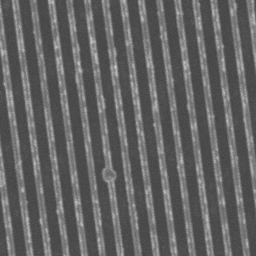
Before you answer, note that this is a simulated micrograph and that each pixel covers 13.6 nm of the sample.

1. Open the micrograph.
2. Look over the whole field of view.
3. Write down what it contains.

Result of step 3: parallel lines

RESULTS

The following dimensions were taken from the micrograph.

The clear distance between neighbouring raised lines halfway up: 0.167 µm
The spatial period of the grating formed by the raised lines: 244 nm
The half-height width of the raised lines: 5.7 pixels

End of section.